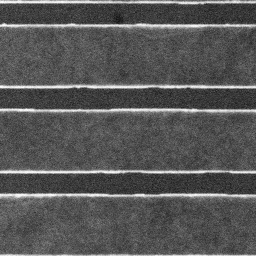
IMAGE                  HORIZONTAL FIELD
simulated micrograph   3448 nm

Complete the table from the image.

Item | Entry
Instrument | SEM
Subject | lines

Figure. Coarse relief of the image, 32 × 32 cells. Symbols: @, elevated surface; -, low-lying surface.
--------------------------------
--------------------------------
--------------------------------
@@@@@@@@@@@@@@@@@@@@@@@@@@@@@@@@
@@@@@@@@@@@@@@@@@@@@@@@@@@@@@@@@
@@@@@@@@@@@@@@@@@@@@@@@@@@@@@@@@
@@@@@@@@@@@@@@@@@@@@@@@@@@@@@@@@
@@@@@@@@@@@@@@@@@@@@@@@@@@@@@@@@
@@@@@@@@@@@@@@@@@@@@@@@@@@@@@@@@
@@@@@@@@@@@@@@@@@@@@@@@@@@@@@@@@
@@@@@@@@@@@@@@@@@@@@@@@@@@@@@@@@
--------------------------------
--------------------------------
--------------------------------
@@@@@@@@@@@@@@@@@@@@@@@@@@@@@@@@
@@@@@@@@@@@@@@@@@@@@@@@@@@@@@@@@
@@@@@@@@@@@@@@@@@@@@@@@@@@@@@@@@
@@@@@@@@@@@@@@@@@@@@@@@@@@@@@@@@
@@@@@@@@@@@@@@@@@@@@@@@@@@@@@@@@
@@@@@@@@@@@@@@@@@@@@@@@@@@@@@@@@
@@@@@@@@@@@@@@@@@@@@@@@@@@@@@@@@
@--@@@@@@@@@--@-------@@@----@@-
--------------------------------
--------------------------------
@@@@@@@@@@@@@@@@@@@@@@@@@@@@@@@@
@@@@@@@@@@@@@@@@@@@@@@@@@@@@@@@@
@@@@@@@@@@@@@@@@@@@@@@@@@@@@@@@@
@@@@@@@@@@@@@@@@@@@@@@@@@@@@@@@@
@@@@@@@@@@@@@@@@@@@@@@@@@@@@@@@@
@@@@@@@@@@@@@@@@@@@@@@@@@@@@@@@@
@@@@@@@@@@@@@@@@@@@@@@@@@@@@@@@@
@@@@@@@@@@@@@@@@@@@@@@@@@@@@@@@@